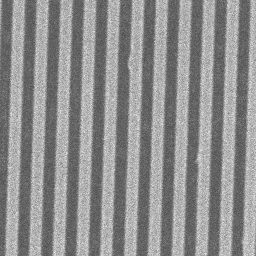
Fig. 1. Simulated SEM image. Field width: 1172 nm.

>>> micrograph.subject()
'parallel lines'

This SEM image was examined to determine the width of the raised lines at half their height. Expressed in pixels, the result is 11.2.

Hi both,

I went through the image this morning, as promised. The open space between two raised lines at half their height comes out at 56.1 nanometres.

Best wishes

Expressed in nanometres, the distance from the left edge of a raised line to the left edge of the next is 109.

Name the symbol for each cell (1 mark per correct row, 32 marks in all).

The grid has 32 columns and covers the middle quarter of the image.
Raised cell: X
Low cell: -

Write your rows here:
X----XX----XX---XXX----XX----XX-
X----XX----XX----XX----XX----XX-
X----XX----XX----XX----XX---XXX-
X----XX----XX----XX----XX---XXX-
X----XX----XX----XX----XX---XXX-
X----XX----XX----XX----XX---XXX-
X----XX----XX----XX---XXX---XXX-
X----XX---XXX----XX---XXX---XXX-
X----XX---XXX----XX---XXX---XXX-
X----XX---XXX----XX---XXX---XXX-
X----XX---XXX----XX---XXX---XXX-
X----XX---XXX---XXX---XXX---XXX-
X---XXX---XXX---XXX---XXX---XXX-
X---XXX---XXX---XXX---XXX---XXX-
X---XXX---XXX---XXX---XXX---XXX-
X---XXX---XXX---XXX---XXX---XXX-
X---XXX---XXX---XXX---XXX---XXX-
X---XXX---XXX---XXX---XXX---XXX-
X---XXX---XXX---XXX---XXX---XXX-
X---XXX---XXX---XXX---XXX---XXX-
X---XXX---XXX---XXX---XXX---XXX-
X---XXX---XXX---XXX---XXX---XX--
X---XXX---XXX---XXX---XXX---XX--
X---XXX---XXX---XXX---XXX---XX--
X---XXX---XXX---XXX---XXX---XX--
X---XXX---XXX---XXX---XX----XX--
X---XXX---XXX---XXX---XX----XX--
X---XXX---XX----XXX---XX----XX--
----XXX---XX----XXX---XX----XX--
----XXX---XX----XXX---XX----XX--
----XXX---XX----XX----XX----XX--
----XX----XX----XX----XX----XX--